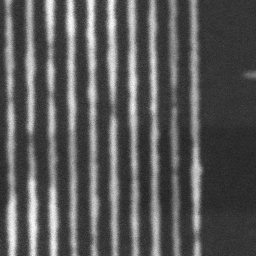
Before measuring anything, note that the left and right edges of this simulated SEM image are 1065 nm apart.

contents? parallel lines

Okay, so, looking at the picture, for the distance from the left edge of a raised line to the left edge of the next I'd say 0.0853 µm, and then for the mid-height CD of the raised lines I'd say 19.8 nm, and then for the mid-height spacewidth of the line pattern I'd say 67.1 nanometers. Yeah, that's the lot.